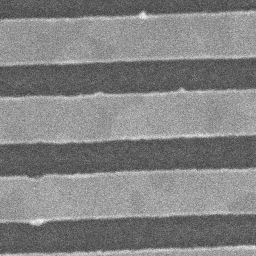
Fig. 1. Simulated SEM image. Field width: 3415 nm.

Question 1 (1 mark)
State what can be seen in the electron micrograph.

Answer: one or a few lines or trenches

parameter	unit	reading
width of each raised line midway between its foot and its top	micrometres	0.6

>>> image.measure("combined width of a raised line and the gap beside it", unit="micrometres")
1.04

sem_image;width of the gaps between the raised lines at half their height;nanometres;443